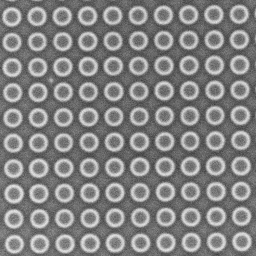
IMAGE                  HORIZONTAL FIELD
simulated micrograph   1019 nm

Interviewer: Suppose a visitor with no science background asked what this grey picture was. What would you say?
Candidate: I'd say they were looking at an array of small figures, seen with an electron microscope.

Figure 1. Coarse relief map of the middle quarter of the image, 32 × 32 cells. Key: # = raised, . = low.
##..####..#####.#####..####..###
##..####..####...####..####..###
#....##....##.....#.....##.....#
................................
...............................#
#...####...###...###...####...##
##..####..#####..####..####..###
##..####..#####..####..####..###
#...####...###...###....###...##
................................
................................
#....###...###...###....###...##
##..####..#####..####..####..###
##..####..#####..####..####..###
##..####...###...###...####...##
................................
................................
......#.....##....##....##....##
##..####...####..####..####...##
##..####..#####..####..####..###
##..####...####..####..####...##
#....###....##....##....##......
................................
...............................#
##...###...###...####..####...##
##..####...####..####..####..###
##..####...####..####..####...##
##...###...###....##....###...##
................................
................................
#....###...###....###...###...##
##..####...####..####..#####.###